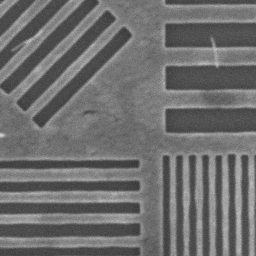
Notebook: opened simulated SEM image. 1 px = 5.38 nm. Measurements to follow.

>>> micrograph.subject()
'groups of lines, slits or small figures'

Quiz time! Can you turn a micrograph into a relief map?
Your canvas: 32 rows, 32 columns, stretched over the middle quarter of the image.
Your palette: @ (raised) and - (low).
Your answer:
--@@@-----@@@@@@@@@@@@@@@@------
-@@@-----@@@@@@@@@@@@@@@@-------
@@@-----@@@@@@@@@@@@@@@@@-------
@@-----@@@@@@@@@@@@@@@@@@-------
@-----@@@@@@@@@@@@@@@@@@@-------
-----@@@@@@@@@@@@@@@@@@@@-------
----@@@@@@@@@@@@@@@@@@@@@@------
---@@@@@@@@@@@@@@@@@@@@@@@@@@@@@
--@@@@@@@@@@@@@@@@@@@@@@@@@@@@@@
-@@@@@@@@@@@@@@@@@@@@@@@@@@@@@@@
@@@@@@@@@@@@@@@@@@@@@@@@@@@@@@@@
@@@@@@--@@@@@@@@@@@@@@@@@-------
@@@@-----@@@-@@@@@@@@@@@@-------
@@@@@@@@@@@@@-@@@@@@@@@@@-------
@@@@@@@@@@@@@@@@@@@@@@@@@-------
@@@@@@@@@@@@@@@@@@@@@@@@@-------
@@@@@@@@@@@@@@@@@@@@@@@@@-------
@@@@@@@@@@@@@@@@@@@@@@@@@@@@@@@@
@@@@@@@@@@@@@@@@@@@@@@@@@@@@@@@@
@@@@@@@@@@@@@@@@@@@@@@@@@@@@@@@@
@@@@@@@@@@@@@@@@@@@@@@@@@@@@@@@@
@@@@@@@@@@@@@@@@@@@@@@-@@@@@@@@@
@@@@@@@-@@@@@@@@@@@@@@@@@@@@@@@@
@@@@@@@@@@@@@@@@@@@@@@@@---@--@-
-------------------@@@@@---@--@-
-------------------@@@@@---@--@-
@@@@@@@@@@@@@@@@@@@@@@@@---@--@-
@@@@@@@@@@@@@@@@@@@@@@@@---@--@-
@@@@@@@@@@@@@@@@@@@@@@@@---@--@-
-------------------@@@@@---@--@-
-------------------@@@@@---@--@-
-------------------@@@@@---@--@-